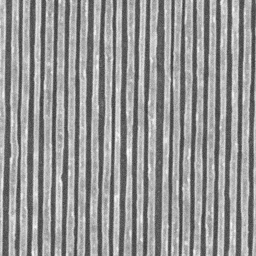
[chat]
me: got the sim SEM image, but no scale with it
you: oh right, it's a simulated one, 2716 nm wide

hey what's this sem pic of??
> parallel lines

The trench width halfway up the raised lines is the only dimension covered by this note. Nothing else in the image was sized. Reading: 53 nanometres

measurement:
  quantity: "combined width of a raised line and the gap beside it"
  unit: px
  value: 11.6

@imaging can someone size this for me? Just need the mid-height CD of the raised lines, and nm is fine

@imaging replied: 68.3